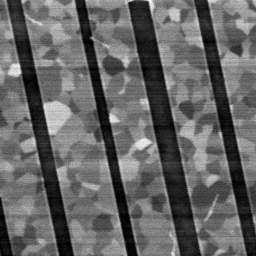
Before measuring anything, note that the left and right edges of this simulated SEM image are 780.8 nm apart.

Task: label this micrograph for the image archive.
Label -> one or a few lines or trenches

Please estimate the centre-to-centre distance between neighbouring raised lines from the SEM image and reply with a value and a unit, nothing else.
186 nm